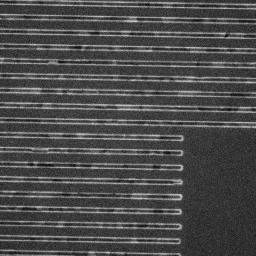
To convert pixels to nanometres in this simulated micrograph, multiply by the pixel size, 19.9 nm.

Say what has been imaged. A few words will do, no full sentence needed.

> parallel lines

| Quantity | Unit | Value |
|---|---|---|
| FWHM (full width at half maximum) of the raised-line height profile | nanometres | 94.4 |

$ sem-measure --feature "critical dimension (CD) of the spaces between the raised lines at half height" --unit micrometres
0.206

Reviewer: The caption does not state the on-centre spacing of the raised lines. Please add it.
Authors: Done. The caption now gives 293 nanometers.